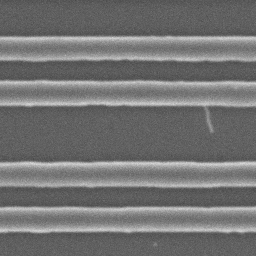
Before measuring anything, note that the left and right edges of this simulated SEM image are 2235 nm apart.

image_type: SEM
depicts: lines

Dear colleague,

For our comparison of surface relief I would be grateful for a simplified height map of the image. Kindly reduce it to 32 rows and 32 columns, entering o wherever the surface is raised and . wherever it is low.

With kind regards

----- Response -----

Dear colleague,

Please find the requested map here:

................................
................................
................................
................................
................................
oooooooooooooooooooooooooooooooo
oooooooooooooooooooooooooooooooo
....o...........................
................................
................................
oooooooooooooooooooooooooooooooo
oooooooooooooooooooooooooooooooo
oooooooooooooooooooooooooooooooo
................................
................................
................................
................................
................................
................................
................................
oooooooooooooooooooooooooooooooo
oooooooooooooooooooooooooooooooo
oooooooooooooooooooooooooooooooo
................................
................................
................................
oooooooooooooooooooooooooooooooo
oooooooooooooooooooooooooooooooo
oooooooooooooooooooooooooooooooo
................................
................................
................................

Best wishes